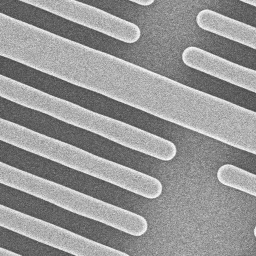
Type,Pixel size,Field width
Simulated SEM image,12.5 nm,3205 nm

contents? groups of lines, slits or small figures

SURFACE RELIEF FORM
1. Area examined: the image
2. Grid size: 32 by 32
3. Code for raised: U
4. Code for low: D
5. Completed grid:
DDDDUUUUUUUDDDDDDUUDDDDDDDDDDDDU
DDDDDDUUUUUUUDDDDDDDDDDDDUUDDDDD
UUDDDDDDDUUUUUUDDDDDDDDDDUUUUDDD
UUUUUDDDDDDUUUUUUDDDDDDDDUUUUUUU
UUUUUUUDDDDDDDUUUDDDDDDDDDDDUUUU
UUUUUUUUUUDDDDDDDDDDDDDDDDDDDDUU
UUUUUUUUUUUUUDDDDDDDDDDUUUDDDDDD
DDUUUUUUUUUUUUUDDDDDDDDUUUUUDDDD
DDDDUUUUUUUUUUUUUUDDDDDDUUUUUUUD
DDDDDDDUUUUUUUUUUUUUDDDDDDDUUUUU
UUUDDDDDDUUUUUUUUUUUUUUDDDDDDUUU
UUUUUDDDDDDDUUUUUUUUUUUUUDDDDDDD
DUUUUUUUDDDDDDDUUUUUUUUUUUUUDDDD
DDDDUUUUUUDDDDDDDUUUUUUUUUUUUUDD
DDDDDDUUUUUUUDDDDDDDUUUUUUUUUUUU
UUDDDDDDDUUUUUUUDDDDDDUUUUUUUUUU
UUUUUDDDDDDDUUUUUUDDDDDDDUUUUUUU
UUUUUUUDDDDDDDUUUUUUUDDDDDDUUUUU
DDDUUUUUUUDDDDDDUUUUUUDDDDDDDDUU
DDDDDUUUUUUUDDDDDDDUUUDDDDDDDDDD
UDDDDDDDUUUUUUUDDDDDDDDDDDDDDDDD
UUUDDDDDDDUUUUUUUUDDDDDDDDDUUUUD
UUUUUUDDDDDDDUUUUUUUDDDDDDDUUUUU
DDUUUUUUUDDDDDDUUUUUDDDDDDDDDDUU
DDDDUUUUUUUDDDDDDDUUDDDDDDDDDDDD
DDDDDDDUUUUUUUDDDDDDDDDDDDDDDDDD
UUDDDDDDDUUUUUUUDDDDDDDDDDDDDDDD
UUUUUDDDDDDDUUUUUUDDDDDDDDDDDDDD
DUUUUUUUDDDDDDUUUUDDDDDDDDDDDDDD
DDDUUUUUUUDDDDDDDDDDDDDDDDDDDDDD
DDDDDDUUUUUUDDDDDDDDDDDDDDDDDDDD
UUDDDDDDUUUUUUUDDDDDDDDDDDDDDDDD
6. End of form